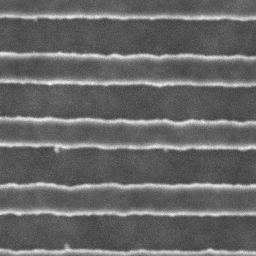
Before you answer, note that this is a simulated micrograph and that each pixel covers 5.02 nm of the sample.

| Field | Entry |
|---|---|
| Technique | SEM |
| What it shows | lines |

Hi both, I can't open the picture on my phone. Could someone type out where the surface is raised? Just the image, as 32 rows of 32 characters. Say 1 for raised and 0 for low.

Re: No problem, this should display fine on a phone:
11111111111111111111111111111111
11111111111111111111111111111111
00000000000000000000000000000000
00000000000000000000000000000000
00000000000000000000000000000000
00000000000000000000000000000000
00000000000000000000000000000000
11111111111111111111111111111111
11111111111111111111111111111111
11111111111111111111111111111111
00000010001111111111111111111111
00000000000000000000000000000000
00000000000000000000000000000000
00000000000000000000000000000000
00000000000000000000000000000000
11111111111111111111111111111111
11111111111111111111111111111111
11111111111111111111111111111111
00000000100001101110011111111111
00000000000000000000000000000000
00000000000000000000000000000000
00000000000000000000000000000000
00000000000000000000000000000000
11111111111111111111111111111111
11111111111111111111111111111111
11111111111111111111111111111111
11111111111111111111111111111111
00000000000000000000000000000000
00000000000000000000000000000000
00000000000000000000000000000000
00000000000000000000000000000000
11111111111111001111111001111110